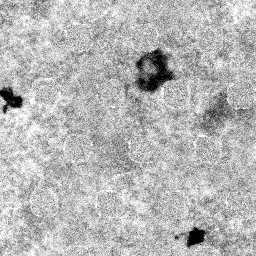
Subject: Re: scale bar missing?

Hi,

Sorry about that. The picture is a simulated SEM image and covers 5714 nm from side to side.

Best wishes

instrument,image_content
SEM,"a regular array of raised bodies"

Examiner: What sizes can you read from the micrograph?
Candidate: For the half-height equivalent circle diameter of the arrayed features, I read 0.613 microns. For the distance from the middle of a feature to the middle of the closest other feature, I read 1.42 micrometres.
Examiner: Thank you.